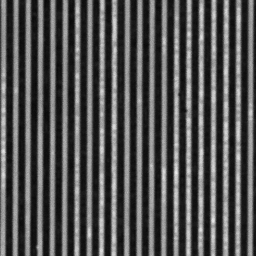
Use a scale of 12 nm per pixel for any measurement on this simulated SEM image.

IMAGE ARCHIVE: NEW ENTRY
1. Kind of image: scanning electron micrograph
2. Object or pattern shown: parallel lines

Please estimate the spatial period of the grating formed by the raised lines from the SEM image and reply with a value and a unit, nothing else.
148 nm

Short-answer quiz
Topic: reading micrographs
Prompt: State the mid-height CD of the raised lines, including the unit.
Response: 64.6 nanometres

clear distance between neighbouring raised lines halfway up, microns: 0.0856